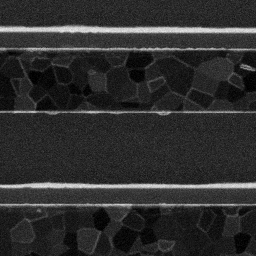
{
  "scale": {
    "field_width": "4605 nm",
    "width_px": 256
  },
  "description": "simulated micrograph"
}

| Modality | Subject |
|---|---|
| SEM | lines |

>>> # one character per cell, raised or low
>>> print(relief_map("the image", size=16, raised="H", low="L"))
LLLLLLLLLLLLLLLL
LLLLLLLLLLLLLLLL
HHHHHHHHHHHHHHHH
HHHHHHHHHHHHHHHH
HHHHHHHHHHHHHHHH
HHHHHHHHHHHHHHHH
HHHHHHHHHHHHHHHH
LLLLLLLLLLLLLLLL
LLLLLLLLLLLLLLLL
LLLLLLLLLLLLLLLL
LLLLLLLLLLLLLLLL
LLLLLLLLLLLLLLLL
HHHHHHHHHHHHHHHH
HHHHHHHHHHHHHHHH
HHHHHHHHHHHHHHHH
HHHHHHHHHHHHHHHH